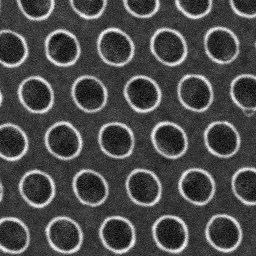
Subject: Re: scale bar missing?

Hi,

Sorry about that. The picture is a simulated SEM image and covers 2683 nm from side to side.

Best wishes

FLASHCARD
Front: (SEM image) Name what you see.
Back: a regular array of holes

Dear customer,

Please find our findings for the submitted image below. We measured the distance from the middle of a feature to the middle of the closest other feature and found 555 nm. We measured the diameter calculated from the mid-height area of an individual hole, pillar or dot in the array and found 342 nm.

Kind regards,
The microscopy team